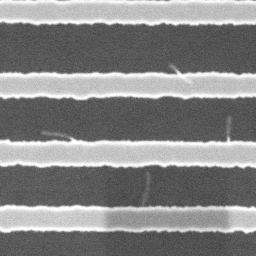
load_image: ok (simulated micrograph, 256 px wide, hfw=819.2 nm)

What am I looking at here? lines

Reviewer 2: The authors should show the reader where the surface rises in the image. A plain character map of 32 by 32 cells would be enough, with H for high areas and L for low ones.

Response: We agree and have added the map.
HHHHHHHHHHHHHHHHHHHHHHHHHHHHHHHH
HHHHHHHHHHHHHHHHHHHHHHHHHHHHHHHH
HHHHHHHHHHHHHHHHHHHHHHHHHHHHHHHH
LLLLLLLLLLLLLLLLLLLLLLLLLLLLLLLL
LLLLLLLLLLLLLLLLLLLLLLLLLLLLLLLL
LLLLLLLLLLLLLLLLLLLLLLLLLLLLLLLL
LLLLLLLLLLLLLLLLLLLLLLLLLLLLLLLL
LLLLLLLLLLLLLLLLLLLLLLLLLLLLLLLL
LLLLLLLLLLLLLLLLLLLLLLLLLLLLLLLL
HHHHHHHHHHHHHHHHHHHHHHHHHHHHHHHH
HHHHHHHHHHHHHHHHHHHHHHHHHHHHHHHH
HHHHHHHHHHHHHHHHHHHHHHHHHHHHHHHH
LLLLLLLLLLLLLLLLLLLLLLLLLLLLLLLL
LLLLLLLLLLLLLLLLLLLLLLLLLLLLLLLL
LLLLLLLLLLLLLLLLLLLLLLLLLLLLLLLL
LLLLLLLLLLLLLLLLLLLLLLLLLLLLLLLL
LLLLLLLLLLLLLLLLLLLLLLLLLLLLLLLL
HLLLLLLLLLLLLLLLLLLLLLLLLLLLLLLL
HHHHHHHHHHHHHHHHHHHHHHHHHHHHHHHH
HHHHHHHHHHHHHHHHHHHHHHHHHHHHHHHH
HHHHHHHHHHHHHHHHHHHLHHHHHHHHHHHH
LLLLLLLLLLLLLLLLLLLLLLLLLLLLLLLL
LLLLLLLLLLLLLLLLLLLLLLLLLLLLLLLL
LLLLLLLLLLLLLLLLLLLLLLLLLLLLLLLL
LLLLLLLLLLLLLLLLLLLLLLLLLLLLLLLL
LLLLLLLLLLLLLLLLLLLLLLLLLLLLLLLL
HHHHHHHHHHHHHHHHHHHHHHHHHHHHHHHH
HHHHHHHHHHHHHHHHHHHHHHHHHHHHHHHH
HHHHHHHHHHHHHHHHHHHHHHHHHHHHHHHH
LLLLLLLLLLLLLLLLLLLLLLLLLLLLLLLL
LLLLLLLLLLLLLLLLLLLLLLLLLLLLLLLL
LLLLLLLLLLLLLLLLLLLLLLLLLLLLLLLL